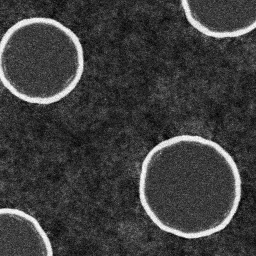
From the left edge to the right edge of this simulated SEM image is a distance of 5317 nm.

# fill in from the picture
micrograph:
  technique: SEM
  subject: raised bodies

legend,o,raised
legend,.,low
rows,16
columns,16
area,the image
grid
............oooo
.oo.........oooo
ooooo...........
ooooo...........
ooooo...........
.ooo............
................
................
................
..........oooo..
.........oooooo.
.........oooooo.
.........oooooo.
oo........oooo..
ooo........oo...
ooo.............